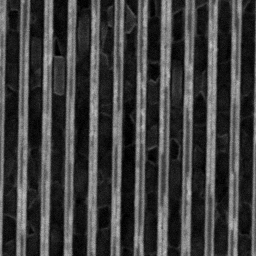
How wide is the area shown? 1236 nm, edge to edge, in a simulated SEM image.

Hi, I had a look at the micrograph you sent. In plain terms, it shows parallel lines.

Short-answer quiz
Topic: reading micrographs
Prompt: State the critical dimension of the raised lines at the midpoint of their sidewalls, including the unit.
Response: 38 nm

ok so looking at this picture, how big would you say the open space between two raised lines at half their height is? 0.0766 um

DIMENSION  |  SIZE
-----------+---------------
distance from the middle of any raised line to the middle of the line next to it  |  0.114 um